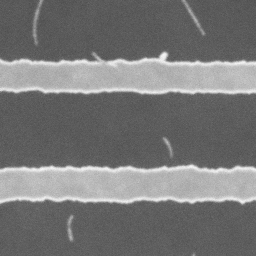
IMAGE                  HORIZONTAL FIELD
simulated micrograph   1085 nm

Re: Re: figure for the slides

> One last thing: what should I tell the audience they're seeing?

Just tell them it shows lines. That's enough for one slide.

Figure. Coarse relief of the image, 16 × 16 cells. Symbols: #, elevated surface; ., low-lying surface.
................
................
................
................
################
################
................
................
................
................
.######...###..#
################
################
................
................
................